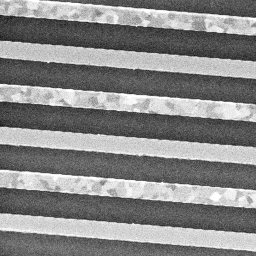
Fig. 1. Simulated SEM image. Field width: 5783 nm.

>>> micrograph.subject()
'lines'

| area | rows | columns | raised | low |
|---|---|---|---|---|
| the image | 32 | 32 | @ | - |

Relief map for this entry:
@@@@@@@@@@----------------------
@@@@@@@@@@@@@@@@@@@@@@----------
--------@@@@@@@@@@@@@@@@@@@@@@@@
---------------------@@@@@@@@@@@
--------------------------------
@@@@----------------------------
@@@@@@@@@@@@@@@@@---------------
----@@@@@@@@@@@@@@@@@@@@@@@@@---
----------------@@@@@@@@@@@@@@@@
-----------------------------@@@
--------------------------------
@@@@@@@@@@@@--------------------
@@@@@@@@@@@@@@@@@@@@@@@@--------
-----------@@@@@@@@@@@@@@@@@@@@@
-----------------------@@@@@@@@@
--------------------------------
@@@@@@@@------------------------
@@@@@@@@@@@@@@@@@@@@------------
-------@@@@@@@@@@@@@@@@@@@@@@@@@
--------------------@@@@@@@@@@@@
--------------------------------
@@------------------------------
@@@@@@@@@@@@@@@@----------------
--@@@@@@@@@@@@@@@@@@@@@@@@@@----
-------------@@@@@@@@@@@@@@@@@@@
--------------------------@@@@@@
--------------------------------
@@@@@@@@@@----------------------
@@@@@@@@@@@@@@@@@@@@@@----------
----------@@@@@@@@@@@@@@@@@@@@@@
---------------------@@@@@@@@@@@
--------------------------------